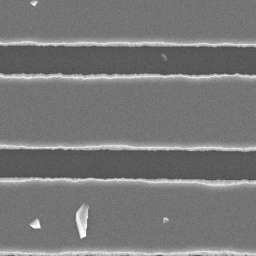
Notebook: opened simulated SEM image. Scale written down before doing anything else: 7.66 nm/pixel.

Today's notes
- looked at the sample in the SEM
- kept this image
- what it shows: lines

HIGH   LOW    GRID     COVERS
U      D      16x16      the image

UUUUUUUUUUUUUUUU
UUUUUUUUUUUUUUUU
UUUUUUUUUUUUUUUU
DDDDDDDDDDDDDDDD
DDDDDDDDDDDDDDDD
UUUUUUUUUUUUUUUU
UUUUUUUUUUUUUUUU
UUUUUUUUUUUUUUUU
UUUUUUUUUUUUUUUU
DDDDDDDDDDDDDDDD
DDDDDDDDDDDDDDDD
UUUUUUUUUUUUUUUU
UUUUUUUUUUUUUUUU
UUUUUUUUUUUUUUUU
UUUUUUUUUUUUUUUU
UUUUUUUUUUUUUUUU